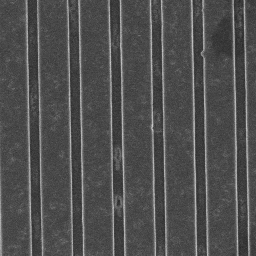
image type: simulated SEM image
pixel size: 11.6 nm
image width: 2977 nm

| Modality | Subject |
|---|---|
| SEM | parallel lines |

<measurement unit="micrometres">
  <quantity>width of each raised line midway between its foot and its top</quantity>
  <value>0.353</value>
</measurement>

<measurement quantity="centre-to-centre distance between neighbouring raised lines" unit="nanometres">480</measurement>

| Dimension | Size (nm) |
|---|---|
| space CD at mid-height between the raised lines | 125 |